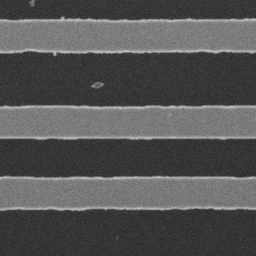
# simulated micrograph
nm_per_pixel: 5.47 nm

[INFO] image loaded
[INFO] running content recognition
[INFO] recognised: lines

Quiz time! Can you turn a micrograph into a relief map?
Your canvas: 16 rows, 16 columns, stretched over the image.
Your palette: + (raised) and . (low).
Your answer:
................
++++++++++++++++
++++++++++++++++
................
................
................
................
++++++++++++++++
++++++++++++++++
................
................
++++++++++++++++
++++++++++++++++
................
................
................